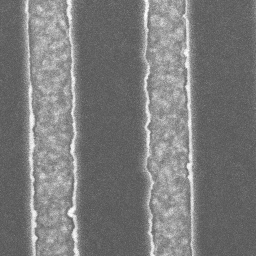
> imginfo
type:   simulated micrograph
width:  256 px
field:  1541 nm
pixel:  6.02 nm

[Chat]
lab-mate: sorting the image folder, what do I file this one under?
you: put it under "one or a few lines or trenches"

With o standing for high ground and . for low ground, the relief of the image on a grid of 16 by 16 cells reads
oo..ooooo...oooo
oo..ooooo...oooo
oo..ooooo...oooo
oo..ooooo...oooo
oo..ooooo...oooo
oo..ooooo...oooo
oo...oooo...oooo
oo...oooo...oooo
oo...oooo...oooo
oo..ooooo...oooo
oo...oooo...oooo
oo...oooo...oooo
oo...oooo...oooo
oo..ooooo...oooo
oo...oooo...oooo
oo...ooooo..oooo